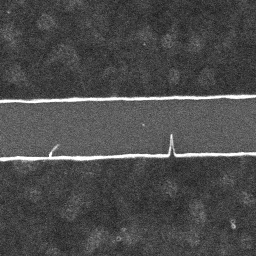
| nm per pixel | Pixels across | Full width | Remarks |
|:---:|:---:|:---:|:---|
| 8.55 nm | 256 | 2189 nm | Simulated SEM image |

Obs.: one or a few lines or trenches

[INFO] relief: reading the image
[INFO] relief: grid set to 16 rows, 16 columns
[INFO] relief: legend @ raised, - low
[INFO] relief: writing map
@@@@@@@@@@@@@@@@
@@@@@@@@@@@@@@@@
@@@@@@@@@@@@@@@@
@@@@@@@@@@@@@@@@
@@@@@@@@@@@@@@@@
@@@@@@@@@@@@@@@@
----------------
----------------
----------------
----------------
@@@@@@@@@@@@@@@@
@@@@@@@@@@@@@@@@
@@@@@@@@@@@@@@@@
@@@@@@@@@@@@@@@@
@@@@@@@@@@@@@@@@
@@@@@@@@@@@@@@@@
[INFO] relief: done